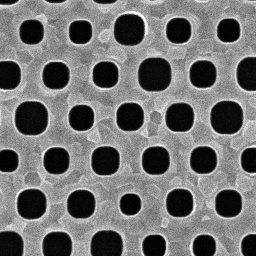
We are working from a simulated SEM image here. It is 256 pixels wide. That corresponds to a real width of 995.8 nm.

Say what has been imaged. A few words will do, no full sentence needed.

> a regular array of holes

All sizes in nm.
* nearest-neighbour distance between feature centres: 190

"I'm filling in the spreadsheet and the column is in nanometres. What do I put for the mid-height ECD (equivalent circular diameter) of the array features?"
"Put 109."